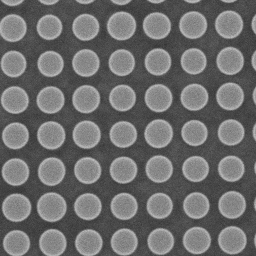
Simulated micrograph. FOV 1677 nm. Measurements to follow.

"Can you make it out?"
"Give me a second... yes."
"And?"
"an array of small figures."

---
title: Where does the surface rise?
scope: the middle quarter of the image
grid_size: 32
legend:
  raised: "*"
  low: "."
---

..*******..*******..*******..***
...*****....*****....*****....**
....***......***......***.......
................................
................................
....***.......**......***......*
...*****....*****....*****....**
...******..*******..*******..***
..*******..*******..*******..***
..*******...******..*******..***
...*****....*****....*****....**
...****......***......***.......
................................
................................
....***.......**......****.....*
...*****....*****....******...**
..*******...******..*******...**
..*******...******..*******...**
..*******...******..*******...**
...******...*****....*****.....*
....****.....***......***.......
................................
................................
..............**......****.....*
...*****....******...******...**
...******...******...******...**
...******...******...******...**
...******...******...******...**
...******...*****....*****.....*
....****......**................
................................
................................